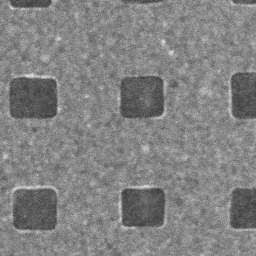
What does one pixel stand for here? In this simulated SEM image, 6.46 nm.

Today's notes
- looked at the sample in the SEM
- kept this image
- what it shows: holes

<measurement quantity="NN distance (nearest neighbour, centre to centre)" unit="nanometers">701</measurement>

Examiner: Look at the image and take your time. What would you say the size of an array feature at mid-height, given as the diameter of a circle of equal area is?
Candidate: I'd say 0.312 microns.